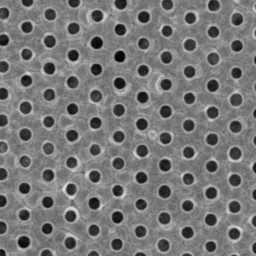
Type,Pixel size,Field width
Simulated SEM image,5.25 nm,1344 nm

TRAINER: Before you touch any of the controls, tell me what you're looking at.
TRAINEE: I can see a regular array of holes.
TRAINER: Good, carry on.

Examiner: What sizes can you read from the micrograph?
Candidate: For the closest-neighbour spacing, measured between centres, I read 140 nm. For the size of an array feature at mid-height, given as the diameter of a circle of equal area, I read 64.9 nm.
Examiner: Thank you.